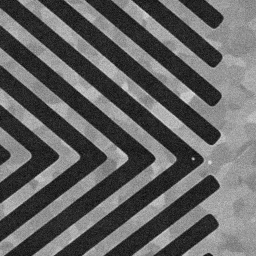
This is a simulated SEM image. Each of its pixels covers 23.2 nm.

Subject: groups of lines, slits or small figures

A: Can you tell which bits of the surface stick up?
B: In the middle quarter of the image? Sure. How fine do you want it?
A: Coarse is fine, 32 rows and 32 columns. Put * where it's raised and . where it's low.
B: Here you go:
*.......*****.......*****......*
**.......*****.......*****......
***.......*****.......*****.....
*****.......****.......*****....
.*****.......****.......*****...
..*****.......*****.......****..
...*****.......*****.......*****
....*****.......*****.......****
......****.......*****.......***
.......*****.......****.......**
*.......*****.......*****.......
**.......*****.......*****......
****......*****.......*****.....
*****.......*****......*****....
.*****.......*****.......****...
..*****.......*****.......*****.
...*****.......*****.......*****
.....****.......*****.......****
......*****......*****.......***
.......*****.......****.......**
*.......*****.......*****.......
**.......*****.......*****......
****......*****.......*****.....
****.......*****.......*****....
***.......*****........*****....
**.......*****.......*****......
........*****.......*****.......
......******.......*****.......*
.....*****........*****.......**
....*****.......*****........***
..******.......*****.......*****
.*****........*****.......*****.